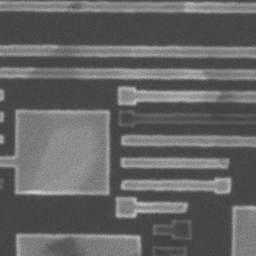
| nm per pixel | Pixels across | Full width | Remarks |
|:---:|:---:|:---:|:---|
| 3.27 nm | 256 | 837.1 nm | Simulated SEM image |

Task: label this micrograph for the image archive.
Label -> wiring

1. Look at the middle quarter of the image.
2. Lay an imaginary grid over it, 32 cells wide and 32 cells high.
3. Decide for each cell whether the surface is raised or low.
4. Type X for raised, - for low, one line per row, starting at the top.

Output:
--------------------------------
XXXXXXXXXXXXXXXXXXXXXXXXXXXXXXX-
XXXXXXXXXXXXXXXXXXXXXXXXXXXXXXXX
--------------XX-XXXXXXXXXXXXXXX
--------------------------------
--------------------------------
--------------XXXX--------------
--------------XXXXXXXXXXXXXXXXXX
--------------XXXXXXXXXXXXXXXXXX
--------------XXXX--------------
--------------------------------
--------------------------------
XXXXXXXXXXX---XXXX--------------
XXXXXXXXXXX---XXXXXXXXXXXXXXXXXX
XXXXXXXXXXX---XXXXXXXXXXXXXXXXXX
XXXXXXXXXXX---------------------
XXXXXXXXXXX---------------------
XXXXXXXXXXX---------------------
XXXXXXXXXXX----XXXXXXXXXXXXXXXXX
XXXXXXXXXXX----XXXXXXXXXXXXXXXXX
XXXXXXXXXXX---------------------
XXXXXXXXXXX---------------------
XXXXXXXXXXX---------------------
XXXXXXXXXXX---------------------
XXXXXXXXXXX---XXXXXXXXXXXXXXXXXX
XXXXXXXXXXX----XXXXXXXXXXXXXXXXX
XXXXXXXXXXX---------------------
XXXXXXXXXXX---------------------
XXXXXXXXXXX---------------------
XXXXXXXXXXX----XXXXXXXXXXXXXXXXX
XXXXXXXXXXX---XXXXXXXXXXXXXXXXXX
XXXXXXXXXXX-----------------XX-X